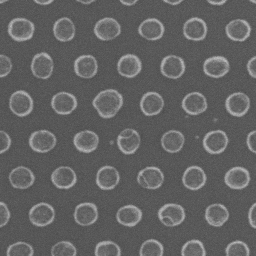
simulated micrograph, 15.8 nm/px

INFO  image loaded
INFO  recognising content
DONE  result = a regular array of raised bodies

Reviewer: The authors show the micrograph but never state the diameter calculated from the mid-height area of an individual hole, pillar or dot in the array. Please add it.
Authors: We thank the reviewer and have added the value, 345 nm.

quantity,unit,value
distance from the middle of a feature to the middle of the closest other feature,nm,669